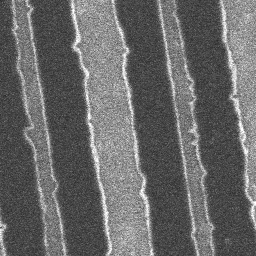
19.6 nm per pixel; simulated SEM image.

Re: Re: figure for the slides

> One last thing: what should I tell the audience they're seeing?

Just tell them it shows one or a few lines or trenches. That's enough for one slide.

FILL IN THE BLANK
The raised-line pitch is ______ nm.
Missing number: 1450